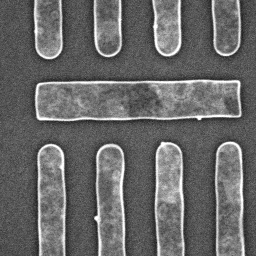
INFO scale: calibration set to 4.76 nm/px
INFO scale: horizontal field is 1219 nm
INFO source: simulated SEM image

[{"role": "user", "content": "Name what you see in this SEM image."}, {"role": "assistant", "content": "groups of lines, slits or small figures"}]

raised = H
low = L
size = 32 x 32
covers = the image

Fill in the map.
LLLLHHHHLLLLHHHLLLLHHHLLLLLHHHLL
LLLLHHHHLLLLHHHLLLLHHHLLLLLHHHLL
LLLLHHHHLLLLHHHLLLLHHHLLLLLHHHLL
LLLLLHHHLLLLHHHLLLLHHHLLLLLHHHLL
LLLLHHHHLLLLHHHLLLLHHHLLLLLHHHLL
LLLLLHHHLLLLHHHLLLLLHHLLLLLHHHLL
LLLLLHHHLLLLHHHLLLLLHHLLLLLHHLLL
LLLLLLLLLLLLLLLLLLLLLLLLLLLLLLLL
LLLLLLLLLLLLLLLLLLLLLLLLLLLLLLLL
LLLLLLLLLLLLLLLLLLLLLLLLLLLLLLLL
LLLLLHHHHHHHHHHHHHHHHHHHHHHHHHLL
LLLLLHHHHHHHHHHHHHHHHHHLHHHHHHLL
LLLLLHHHHHHHHHHHHHHHHHHHHHHHHHLL
LLLLLHHHHHHHHHHHHHHHHHHHHHHHHHLL
LLLLLHHHHHHHHHHHHHHHHHHHHHHLHHLL
LLLLLLLLLLLLLLLLLLLLLLLLLLLLLLLL
LLLLLLLLLLLLLLLLLLLLLLLLLLLLLLLL
LLLLLLLLLLLLLLLLLLLLLLLLLLLLLLLL
LLLLLHHLLLLLLHHLLLLLHHLLLLLHHHLL
LLLLLHHHLLLLHHHLLLLLHHHLLLLHHHLL
LLLLLHHHLLLLHHHLLLLLHHHLLLLHHHLL
LLLLLHHHLLLLHHHLLLLLHHHLLLLHHHLL
LLLLLHHHLLLLHHHLLLLLHHHLLLLHHHLL
LLLLLHLHLLLLHHHLLLLLHHLLLLLHHHLL
LLLLLHHHLLLLHHHLLLLHHHHLLLLHHHLL
LLLLLHHHLLLLHHHLLLLHHHHLLLLHHHLL
LLLLLHHHLLLLHHHLLLLHHHHLLLLHHHLL
LLLLLHHHLLLLHHHLLLLLHHHLLLLHHHLL
LLLLLHHHLLLLHHHLLLLLHHHLLLLHHHLL
LLLLLHHHLLLLHHHLLLLLHHHLLLLHHHLL
LLLLLHHHLLLLHHHLLLLLHHHLLLLHHHLL
LLLLLHHHLLLLHHHHLLLLHHHLLLLHHHLL